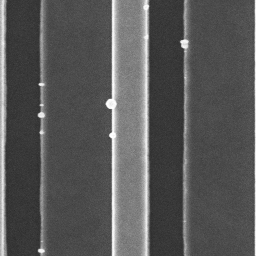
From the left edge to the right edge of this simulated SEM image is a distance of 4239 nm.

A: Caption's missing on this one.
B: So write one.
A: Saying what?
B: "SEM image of lines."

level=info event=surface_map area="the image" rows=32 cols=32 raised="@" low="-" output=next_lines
-----@@@@@@@@@@@@@-----@@@@@@@@@
-----@@@@@@@@@@@@@-----@@@@@@@@@
-----@@@@@@@@@@@@@-----@@@@@@@@@
-----@@@@@@@@@@@@@-----@@@@@@@@@
-----@@@@@@@@@@@@@-----@@@@@@@@@
-----@@@@@@@@@@@@@-----@@@@@@@@@
-----@@@@@@@@@@@@@-----@@@@@@@@@
-----@@@@@@@@@@@@@-----@@@@@@@@@
-----@@@@@@@@@@@@@-----@@@@@@@@@
-----@@@@@@@@@@@@@-----@@@@@@@@@
-----@@@@@@@@@@@@@-----@@@@@@@@@
-----@@@@@@@@@@@@@-----@@@@@@@@@
-----@@@@@@@@@@@@@-----@@@@@@@@@
-----@@@@@@@@@@@@@-----@@@@@@@@@
-----@@@@@@@@@@@@@-----@@@@@@@@@
-----@@@@@@@@@@@@@-----@@@@@@@@@
-----@@@@@@@@@@@@@-----@@@@@@@@@
-----@@@@@@@@@@@@@-----@@@@@@@@@
-----@@@@@@@@@@@@@-----@@@@@@@@@
-----@@@@@@@@@@@@@-----@@@@@@@@@
-----@@@@@@@@@@@@@-----@@@@@@@@@
-----@@@@@@@@@@@@@-----@@@@@@@@@
-----@@@@@@@@@@@@@-----@@@@@@@@@
-----@@@@@@@@@@@@@-----@@@@@@@@@
-----@@@@@@@@@@@@@-----@@@@@@@@@
-----@@@@@@@@@@@@@-----@@@@@@@@@
-----@@@@@@@@@@@@@-----@@@@@@@@@
-----@@@@@@@@@@@@@-----@@@@@@@@@
-----@@@@@@@@@@@@@-----@@@@@@@@@
-----@@@@@@@@@@@@@-----@@@@@@@@@
-----@@@@@@@@@@@@@-----@@@@@@@@@
-----@@@@@@@@@@@@@-----@@@@@@@@@